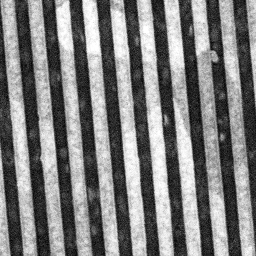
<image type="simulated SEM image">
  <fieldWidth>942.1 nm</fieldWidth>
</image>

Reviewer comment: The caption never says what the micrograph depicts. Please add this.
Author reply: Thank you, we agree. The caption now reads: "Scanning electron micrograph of parallel lines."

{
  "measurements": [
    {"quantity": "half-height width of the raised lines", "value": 0.048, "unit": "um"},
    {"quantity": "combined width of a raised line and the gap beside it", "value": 0.0997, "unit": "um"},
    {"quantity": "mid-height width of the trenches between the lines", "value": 51.2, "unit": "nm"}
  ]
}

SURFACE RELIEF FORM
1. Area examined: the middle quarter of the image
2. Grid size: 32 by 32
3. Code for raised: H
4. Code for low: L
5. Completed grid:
HHHLLLHHHLLLLHHHLLLLHHHLLLLHHHLL
HHHLLLHHHLLLLHHHLLLLHHHLLLLHHHLL
HHHLLLHHHLLLLHHHLLLLHHHLLLLHHHLL
HHHLLLHHHHLLLHHHHLLLHHHLLLLHHHLL
HHHLLLLHHHLLLLHHHLLLHHHLLLLHHHLL
HHHLLLLHHHLLLLHHHLLLHHHHLLLHHHLL
HHHLLLLHHHLLLLHHHLLLLHHHLLLHHHHL
HHHLLLLHHHLLLLHHHLLLLHHHLLLHHHLL
HHHLLLLHHHLLLLHHHLLLLHHHLLLHHHHL
HHHLLLLHHHLLLLHHHLLLLHHHLLLLHHHL
HHHLLLLHHHLLLLHHHLLLLHHHLLLLHHHL
HHHHLLLHHHLLLLHHHLLLLHHHLLLLHHHL
LHHHLLLHHHLLLLHHHLLLLHHHLLLLHHHL
LHHHLLLHHHLLLLHHHLLLLHHHLLLLHHHL
LHHHLLLHHHHLLLHHHLLLLHHHHLLLHHHL
LHHHLLLLHHHLLLLHHLLLLHHHLLLLHHHL
LHHHLLLLHHHLLLLHHHLLLHHHHLLLHHHL
LHHHLLLLHHHLLLLHHHLLLLHHHLLLHHHL
LHHHLLLLHHHLLLLHHHLLLLHHHLLLHHHL
LHHHLLLLHHHLLLLHHHLLLLHHHLLLHHHH
LHHHLLLLHHHLLLLHHHLLLLHHHLLLLHHH
LHHHLLLLHHHLLLLHHHLLLLHHHLLLLHHH
LHHHHLLLHHHLLLLHHHLLLLHHHLLLLHHH
LLHHHLLLHHHLLLLHHHLLLLHHHLLLLHHH
LLHHHLLLHHHHLLLHHHLLLLHHHLLLLHHH
LLHHHLLLHHHHLLLHHHHLLLHHHHLLLHHH
LLHHHLLLLHHHLLLHHHHLLLHHHHLLLHHH
LLHHHLLLLHHHLLLHHHHLLLHHHHLLLHHH
LLHHHLLLLHHHLLLLHHHLLLLHHHLLLHHH
LLHHHLLLLHHHLLLLHHHLLLLHHHLLLHHH
LLHHHLLLLHHHLLLLHHHLLLLHHHLLLHHH
LLHHHLLLLHHHLLLLHHHLLLLHHHLLLLHH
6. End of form